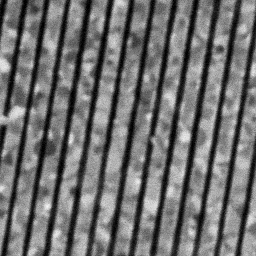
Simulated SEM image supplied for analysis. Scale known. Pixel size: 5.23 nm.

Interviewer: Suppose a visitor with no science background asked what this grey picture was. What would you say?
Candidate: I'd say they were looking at parallel lines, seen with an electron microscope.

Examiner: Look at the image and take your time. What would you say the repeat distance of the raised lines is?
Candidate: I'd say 110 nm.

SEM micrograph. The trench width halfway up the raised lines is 7.53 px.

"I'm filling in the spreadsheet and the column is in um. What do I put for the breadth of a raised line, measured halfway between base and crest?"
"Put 0.0715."